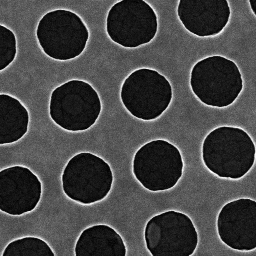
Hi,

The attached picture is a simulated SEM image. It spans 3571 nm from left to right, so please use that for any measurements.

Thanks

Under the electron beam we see holes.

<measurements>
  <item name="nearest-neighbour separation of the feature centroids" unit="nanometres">1010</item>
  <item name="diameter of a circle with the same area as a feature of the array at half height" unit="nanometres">700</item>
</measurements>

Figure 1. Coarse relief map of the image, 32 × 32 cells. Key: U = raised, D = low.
UUUUUUUUUUUUUUDDDDUUUUDDDDDDUUUD
UUUUUUDDDUUUUUDDDDDUUUDDDDDDDUUU
UUUUUDDDDDUUUDDDDDDDUUUDDDDDDUUU
DUUUUDDDDDDUUDDDDDDDUUUDDDDDUUUU
DDUUUDDDDDDUUUDDDDDUUUUUUDUUUUUU
DDUUUDDDDDDUUUUDDDUUUUUUUUUUUUUU
DDUUUUDDDDUUUUUUUUUUUUUUUUUUUUUU
DDUUUUUUUUUUUUUUUUUUUUUUUDDDDUUU
DUUUUUUUUUUUUUUUUUUUUUUUDDDDDDUU
UUUUUUUUUUUUUUUUDDDDUUUUDDDDDDUU
UUUUUUUUDDDUUUUDDDDDDUUUDDDDDDUU
UUUUUUUDDDDDUUUDDDDDDUUUDDDDDDUU
DDUUUUDDDDDDUUUDDDDDDUUUUDDDDUUU
DDDUUUDDDDDDDUUUDDDDDUUUUUUUUUUU
DDDDUUDDDDDDUUUUUDDDUUUUUUUUUUUU
DDDDUUUDDDDDUUUUUUUUUUUUUUUUUUUU
DDDUUUUUUUUUUUUUUUUUUUUUUUDDDDDU
DDUUUUUUUUUUUUUUUUUUUUUUUUDDDDDU
UUUUUUUUUUUUUUUUUUDDDDUUUDDDDDDD
UUUUUUUUUDDDUUUUUDDDDDDUUDDDDDDD
UUUUUUUUDDDDDUUUUDDDDDDUUUDDDDDD
DDDDUUUUDDDDDDUUUDDDDDDUUUUDDDDU
DDDDDUUUDDDDDDUUUDDDDDUUUUUUUUUU
DDDDDUUUDDDDDDUUUUDDDUUUUUUUUUUU
DDDDDUUUUDDDDUUUUUUUUUUUUUUUUUUU
DDDDDUUUUUUUUUUUUUUUUUUUUUUUDDDD
UDDUUUUUUUUUUUUUUUUUUDUUUUUUDDDD
UUUUUUUUUUUUUUUUUUUDDDDDUUUDDDDD
UUUUUUUUUUUDDDUUUUDDDDDDUUUDDDDD
UUUUUUUUUUDDDDDUUUDDDDDDDUUDDDDD
UDDDDDUUUUDDDDDUUUDDDDDDDUUUDDDD
DDDDDDDUUDDDDDDDUUUDDDDDUUUUUUUU